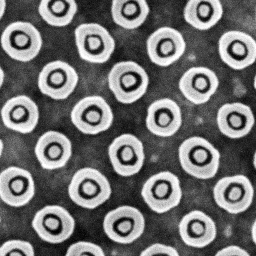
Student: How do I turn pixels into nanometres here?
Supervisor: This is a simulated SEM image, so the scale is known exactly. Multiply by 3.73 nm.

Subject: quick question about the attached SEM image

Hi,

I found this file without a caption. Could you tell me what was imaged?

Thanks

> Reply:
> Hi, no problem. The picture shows a regular array of ring-shaped raised bodies with a dot in the middle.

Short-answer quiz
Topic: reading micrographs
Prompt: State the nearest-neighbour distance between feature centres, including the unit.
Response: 0.186 µm